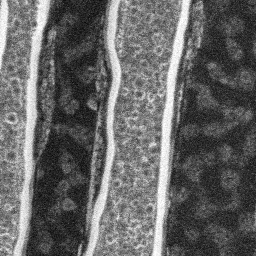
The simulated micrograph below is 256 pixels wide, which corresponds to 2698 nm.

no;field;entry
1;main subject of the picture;one or a few lines or trenches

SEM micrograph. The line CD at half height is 57.9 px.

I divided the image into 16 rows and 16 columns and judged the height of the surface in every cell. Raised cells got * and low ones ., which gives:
***....*****....
***....****.....
**.....****.....
**.....****.....
**.....****.....
**.....****.....
**.....****.....
**.....***......
**.....***......
**.....***......
**.....***......
**.....***......
**....****......
**....****......
*.....****......
*.....****......